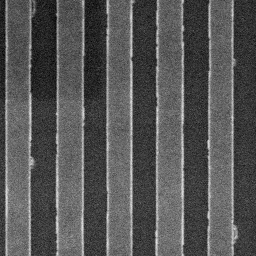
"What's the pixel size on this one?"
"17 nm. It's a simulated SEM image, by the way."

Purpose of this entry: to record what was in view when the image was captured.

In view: lines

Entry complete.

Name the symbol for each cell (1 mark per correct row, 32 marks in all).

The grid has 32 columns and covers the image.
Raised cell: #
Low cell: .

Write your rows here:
.###...###...###....###...###...
.###...###....##....###...###...
.###...###....##....###...###...
.###...###....##....###...###...
.###...###...###....###...###...
.###...###...###....###...###...
.###...###...###....###...###...
.###...###...###....###...###...
.###...###...###....###...###...
.###...###...###....###...###...
.###...###...###....###...###...
.###...###...###....###...###...
.###...###...###....###...###...
.###...###...###....###...###...
.###...###...###....###...###...
.###...###...###....###...###...
.###...###...###....###...###...
.###...###...###....###...###...
.###...###...###....###...###...
.###...###...###....###...###...
.###...###...###....###...###...
.###...###...###....###...###...
.###...###...###....###...###...
.###...###...###....###...###...
.###...###....##....###...###...
.###...###....##....###...###...
.###...###...###....###...###...
.###...###...###....###...###...
.###...###...###....###...###...
.###...###...###....###...###...
.###...###...###....###...###...
.###...###...###....###...###...